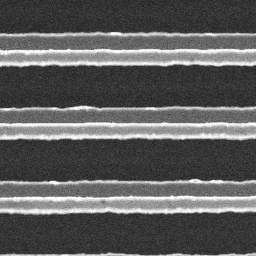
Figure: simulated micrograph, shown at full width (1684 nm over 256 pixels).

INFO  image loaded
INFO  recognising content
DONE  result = lines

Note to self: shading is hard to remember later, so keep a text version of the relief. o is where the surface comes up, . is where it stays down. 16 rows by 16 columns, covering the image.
................
................
oooooooooooooooo
oooooooooooooooo
................
................
................
oooooooooooooooo
oooooooooooooooo
................
................
oooooooooooooooo
oooooooooooooooo
................
................
................